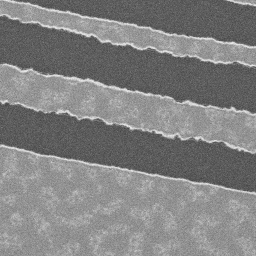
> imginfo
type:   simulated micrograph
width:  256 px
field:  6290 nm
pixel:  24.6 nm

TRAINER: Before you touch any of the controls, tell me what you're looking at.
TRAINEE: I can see one or a few lines or trenches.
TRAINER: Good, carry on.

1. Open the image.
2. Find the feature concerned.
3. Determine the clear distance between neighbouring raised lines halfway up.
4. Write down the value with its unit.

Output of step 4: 1080 nm